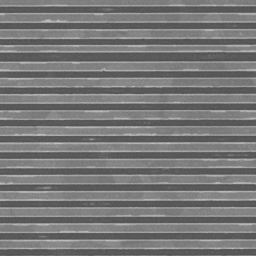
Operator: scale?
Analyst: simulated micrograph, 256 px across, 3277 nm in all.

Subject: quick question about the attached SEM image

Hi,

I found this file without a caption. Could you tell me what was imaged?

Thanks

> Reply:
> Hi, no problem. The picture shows parallel lines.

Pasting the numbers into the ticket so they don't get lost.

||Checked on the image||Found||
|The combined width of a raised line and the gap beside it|207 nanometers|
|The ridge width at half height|114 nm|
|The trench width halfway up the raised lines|101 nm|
